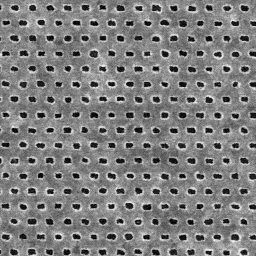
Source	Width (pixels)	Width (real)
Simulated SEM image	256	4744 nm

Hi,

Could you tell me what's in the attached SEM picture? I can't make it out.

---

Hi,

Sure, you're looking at a regular array of holes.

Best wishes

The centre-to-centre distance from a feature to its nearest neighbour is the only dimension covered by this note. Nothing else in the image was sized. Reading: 0.316 microns